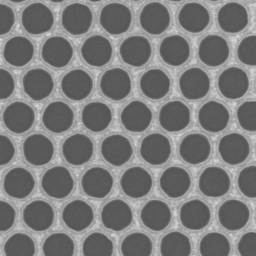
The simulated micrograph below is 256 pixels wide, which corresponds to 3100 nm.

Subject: a regular array of holes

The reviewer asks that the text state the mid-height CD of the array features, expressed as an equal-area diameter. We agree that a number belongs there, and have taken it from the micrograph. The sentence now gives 367 nanometres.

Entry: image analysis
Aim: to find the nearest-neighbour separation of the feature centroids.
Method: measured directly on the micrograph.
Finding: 457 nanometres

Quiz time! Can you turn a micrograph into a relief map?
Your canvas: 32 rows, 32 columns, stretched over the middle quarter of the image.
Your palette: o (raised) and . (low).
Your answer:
oooooooo..oooooooo.ooooooooooooo
ooo.ooooooo....oooooo...ooooooo.
o.....oooo......oooo.....ooooo..
.......ooo......ooo.......ooo...
.......oo........oo.......ooo...
.......oo........oo.......ooo...
.......oo........ooo......ooo...
......oooo......oooo.....ooooo..
o....ooooooo...ooooooo..ooooooo.
ooooooo..oooooooo..oooooooo..ooo
.oooo......ooooo.....oooo.....oo
..ooo......oooo......ooo.......o
..oo........oo........oo........
..oo........oo........oo.......o
..ooo......oooo.......oo.......o
..ooo......oooo......ooo.......o
.oooooo...oooooo....oooooo...ooo
ooo.oooooooooooooooooo..oooooooo
o.....ooooo....ooooo......oooo..
.......ooo......oooo......ooo...
.......oo........oo.......ooo...
.......oo........oo........oo...
.......oo........oo.......ooo...
.......ooo......oooo......oooo..
o....oooooo....oooooo....oooooo.
ooooooooooooo.oooooooooooooooooo
.ooooo.....ooooo....oooooo....oo
..ooo......oooo......oooo......o
..ooo.......oo........oo........
..oo........oo........oo........
..ooo.......oo........oo.......o
..ooo.......ooo......oooo......o